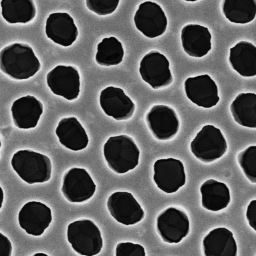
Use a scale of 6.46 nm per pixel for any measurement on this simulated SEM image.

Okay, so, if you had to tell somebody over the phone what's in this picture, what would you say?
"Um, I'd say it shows a regular array of holes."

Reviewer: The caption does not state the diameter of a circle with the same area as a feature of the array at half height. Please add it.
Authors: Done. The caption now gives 210 nanometers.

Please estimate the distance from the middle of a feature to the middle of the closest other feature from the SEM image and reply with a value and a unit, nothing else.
326 nanometres